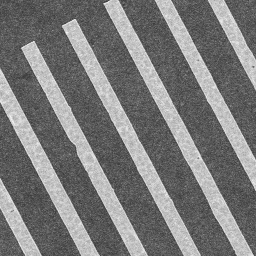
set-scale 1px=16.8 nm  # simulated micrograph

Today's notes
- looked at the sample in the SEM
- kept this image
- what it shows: parallel lines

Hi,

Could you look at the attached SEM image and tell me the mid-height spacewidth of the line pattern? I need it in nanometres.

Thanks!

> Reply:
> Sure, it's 545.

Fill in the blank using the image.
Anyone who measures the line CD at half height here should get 237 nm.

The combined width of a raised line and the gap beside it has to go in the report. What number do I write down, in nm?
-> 777